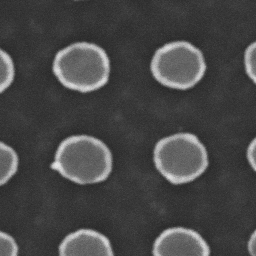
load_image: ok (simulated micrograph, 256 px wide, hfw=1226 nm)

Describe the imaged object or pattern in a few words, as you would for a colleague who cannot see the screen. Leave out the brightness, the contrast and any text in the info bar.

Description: raised bodies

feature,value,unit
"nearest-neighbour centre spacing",444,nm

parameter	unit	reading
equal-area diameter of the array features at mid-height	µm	0.244